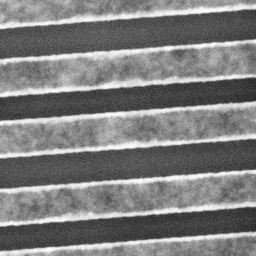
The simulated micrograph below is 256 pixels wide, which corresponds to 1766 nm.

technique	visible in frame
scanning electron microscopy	lines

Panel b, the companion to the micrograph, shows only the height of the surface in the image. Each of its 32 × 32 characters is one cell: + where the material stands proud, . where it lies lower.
++++++++++++++++++++++++++++++++
++++++++++++++++++++++++++......
+++++++++++++...................
................................
................................
..........................++++++
..............++++++++++++++++++
++++++++++++++++++++++++++++++++
++++++++++++++++++++++++++++++++
++++++++++++++++++++++++++++++++
+++++++++++++++++++.............
++++++..........................
................................
.....................+++++++++++
.........+++++++++++++++++++++++
++++++++++++++++++++++++++++++++
++++++++++++++++++++++++++++++++
++++++++++++++++++++++++++++....
+++++++++++++++.................
++..............................
................................
.............................+++
.................+++++++++++++++
...+++++++++++++++++++++++++++++
++++++++++++++++++++++++++++++++
++++++++++++++++++++++++++++++++
++++++++++++++++++++++..........
+++++++++.......................
................................
..........................++++++
.............+++++++++++++++++++
.+++++++++++++++++++++++++++++++